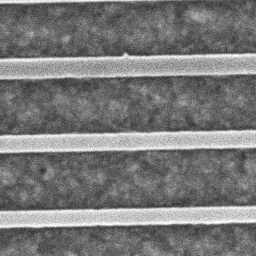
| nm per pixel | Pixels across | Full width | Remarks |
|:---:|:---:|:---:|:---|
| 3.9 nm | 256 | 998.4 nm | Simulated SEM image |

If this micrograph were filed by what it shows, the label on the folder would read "one or a few lines or trenches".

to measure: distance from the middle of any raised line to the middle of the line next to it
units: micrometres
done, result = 0.293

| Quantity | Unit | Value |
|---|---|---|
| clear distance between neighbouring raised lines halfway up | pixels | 57.5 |